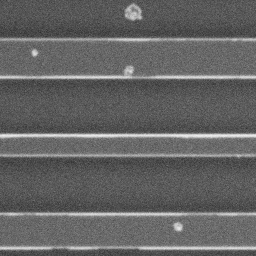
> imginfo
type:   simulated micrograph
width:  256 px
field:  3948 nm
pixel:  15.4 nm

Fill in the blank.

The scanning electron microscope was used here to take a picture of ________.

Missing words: lines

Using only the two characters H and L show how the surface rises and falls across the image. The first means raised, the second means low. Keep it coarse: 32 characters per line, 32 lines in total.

LLLLLLLLLLLLLLLLLLLLLLLLLLLLLLLL
LLLLLLLLLLLLLLLLLLLLLLLLLLLLLLLL
LLLLLLLLLLLLLLLLLLLLLLLLLLLLLLLL
LLLLLLLLLLLLLLLLLLLLLLLLLLLLLLLL
LLLLLLLLLLLLLLLLLLLLLLLLLLLLLLLL
HHHHHHHHHHHHHHHHHHHHHHHHHHHHHHHH
HHHHHHHHHHHHHHHHHHHHHHHHHHHHHHHH
HHHHHHHHHHHHHHHHHHHHHHHHHHHHHHHH
HHHHHHHHHHHHHHHHHHHHHHHHHHHHHHHH
HHHHHHHHHHHHHHHHHHHHHHHHHHHHHHHH
LLLLLLLLLLLLLLLLLLLLLLLLLLLLLLLL
LLLLLLLLLLLLLLLLLLLLLLLLLLLLLLLL
LLLLLLLLLLLLLLLLLLLLLLLLLLLLLLLL
LLLLLLLLLLLLLLLLLLLLLLLLLLLLLLLL
LLLLLLLLLLLLLLLLLLLLLLLLLLLLLLLL
LLLLLLLLLLLLLLLLLLLLLLLLLLLLLLLL
LLLLLLLLLLLLLLLLLLLLLLLLLLLLLLLL
HHHHHHHHHHHHHHHHHHHHHHHHHHHHHHHH
HHHHHHHHHHHHHHHHHHHHHHHHHHHHHHHH
LLLLLLLLLLLLLLLLLLLLLLLLLLLLLLLL
LLLLLLLLLLLLLLLLLLLLLLLLLLLLLLLL
LLLLLLLLLLLLLLLLLLLLLLLLLLLLLLLL
LLLLLLLLLLLLLLLLLLLLLLLLLLLLLLLL
LLLLLLLLLLLLLLLLLLLLLLLLLLLLLLLL
LLLLLLLLLLLLLLLLLLLLLLLLLLLLLLLL
LLLLLLLLLLLLLLLLLLLLLLLLLLLLLLLL
LLLLLLLLLLLLLLLLLLLLLLLLLLLLLLLL
HHHHHHHHHHHHHHHHHHHHHHHHHHHHHHHH
HHHHHHHHHHHHHHHHHHHHHHHHHHHHHHHH
HHHHHHHHHHHHHHHHHHHHHHHHHHHHHHHH
HHHHHHHHHHHHHHHHHHHHHHHHHHHHHHHH
LLLLLLLLLLLLLLLLLLLLLLLLLLLLLLLL